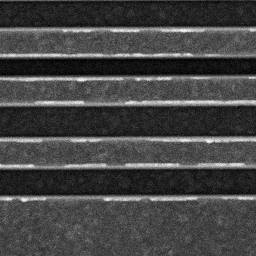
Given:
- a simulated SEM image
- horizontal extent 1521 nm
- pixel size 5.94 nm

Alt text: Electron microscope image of parallel lines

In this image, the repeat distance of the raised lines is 0.327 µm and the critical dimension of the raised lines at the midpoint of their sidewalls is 0.172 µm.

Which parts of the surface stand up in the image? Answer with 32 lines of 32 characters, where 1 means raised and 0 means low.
00000000000000000000000000000000
00000000000000000000000000000000
00000000000000000000000000000000
00000000000000000000000000000000
11111111111111111111111111111111
11111111111111111111111111111111
11111111111111111111111111111111
00000000000000000000000000000000
00000000000000000000000000000000
00000000000000000000000000000000
11111111111111111111111111111111
11111111111111111111111111111111
11111111111111111111111111111111
00000000000000000000000000000000
00000000000000000000000000000000
00000000000000000000000000000000
00000000000000000000000000000000
11111111111111111111111111111111
11111111111111111111111111111111
11111111111111111111111111111111
11111111111111111111111111111111
00000000000000000000000000000000
00000000000000000000000000000000
00000000000000000000000000000000
00000000000000000000000000000000
11111111111111111111111111111111
11111111111111111111111111111111
11111111111111111111111111111111
11111111111111111111111111111111
11111111111111111111111111111111
11111111111111111111111111111111
11111111111111111111111111111111